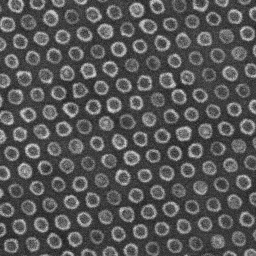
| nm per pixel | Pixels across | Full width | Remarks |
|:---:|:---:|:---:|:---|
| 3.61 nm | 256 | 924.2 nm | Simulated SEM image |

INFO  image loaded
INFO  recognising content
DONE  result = a regular array of raised bodies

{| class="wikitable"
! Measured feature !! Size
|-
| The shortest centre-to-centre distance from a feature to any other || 75.2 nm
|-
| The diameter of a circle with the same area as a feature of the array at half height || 49.2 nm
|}